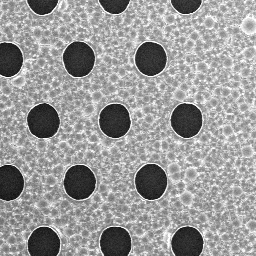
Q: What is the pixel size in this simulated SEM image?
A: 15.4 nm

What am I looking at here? holes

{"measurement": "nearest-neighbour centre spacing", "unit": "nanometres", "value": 1090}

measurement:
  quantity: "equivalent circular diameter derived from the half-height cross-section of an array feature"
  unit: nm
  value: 523